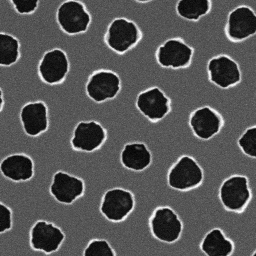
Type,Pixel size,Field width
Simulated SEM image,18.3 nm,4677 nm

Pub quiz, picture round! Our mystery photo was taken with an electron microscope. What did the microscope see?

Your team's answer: a regular array of holes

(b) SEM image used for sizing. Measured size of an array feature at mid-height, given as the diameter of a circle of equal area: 550 nm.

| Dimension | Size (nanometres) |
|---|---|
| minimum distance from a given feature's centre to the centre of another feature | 957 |